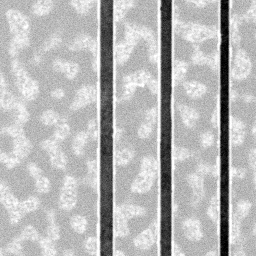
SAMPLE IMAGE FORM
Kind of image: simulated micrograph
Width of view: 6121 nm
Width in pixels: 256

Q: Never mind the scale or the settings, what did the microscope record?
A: parallel lines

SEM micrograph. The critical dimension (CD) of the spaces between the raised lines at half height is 326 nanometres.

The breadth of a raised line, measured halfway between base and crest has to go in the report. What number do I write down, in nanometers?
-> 1110